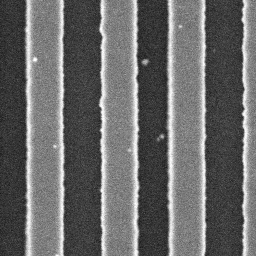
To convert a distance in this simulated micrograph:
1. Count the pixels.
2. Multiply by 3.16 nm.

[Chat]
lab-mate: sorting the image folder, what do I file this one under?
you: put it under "lines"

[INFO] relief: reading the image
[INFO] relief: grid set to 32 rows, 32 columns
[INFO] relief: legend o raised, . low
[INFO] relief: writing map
....oooo.....oooo....ooooo.....o
....oooo.....oooo....oooo.....oo
....oooo.....oooo....oooo.....oo
...ooooo.....oooo....oooo......o
....oooo.....oooo....oooo......o
....oooo.....oooo....ooooo....oo
....oooo.....oooo....ooooo....oo
....oooo.....oooo....ooooo....oo
....oooo.....oooo....ooooo....oo
....oooo.....oooo....ooooo....oo
....oooo.....oooo....oooo......o
...ooooo.....oooo....oooo......o
....oooo.....oooo....oooo......o
....oooo.....oooo....ooooo.....o
....oooo.....oooo....oooo......o
....oooo.....oooo....oooo.....oo
....oooo.....oooo....ooooo.....o
....oooo.....oooo....ooooo.....o
....oooo.....oooo....oooo......o
....oooo.....oooo....oooo.....oo
....oooo.....oooo....ooooo.....o
...ooooo.....oooo....ooooo.....o
....oooo.....oooo....ooooo.....o
....oooo.....oooo....oooo......o
....oooo.....oooo....ooooo.....o
....oooo.....oooo....ooooo....oo
....oooo.....oooo....ooooo.....o
....oooo.....oooo....ooooo.....o
....oooo.....oooo....ooooo.....o
....oooo.....oooo....ooooo.....o
....oooo.....oooo....ooooo.....o
....oooo.....oooo....ooooo.....o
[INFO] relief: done